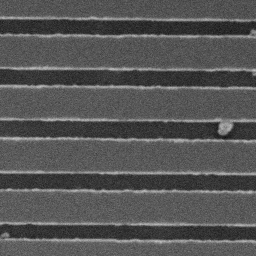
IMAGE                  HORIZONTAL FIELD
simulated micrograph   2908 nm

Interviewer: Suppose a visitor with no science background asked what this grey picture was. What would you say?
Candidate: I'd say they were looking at lines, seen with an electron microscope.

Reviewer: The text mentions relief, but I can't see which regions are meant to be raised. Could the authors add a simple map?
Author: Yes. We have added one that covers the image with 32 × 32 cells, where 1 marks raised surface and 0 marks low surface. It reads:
11111111111111111111111111111111
11111111111111111111111111111111
00000000000000000001111111111111
00000000000000000000000000000000
11111111111110011111100000000001
11111111111111111111111111111111
11111111111111111111111111111111
11111111111111111111111111111111
11111111111111111111111111111111
00000000000000000000000000000000
00000000000000000000000000000000
11111111111111111111111111111111
11111111111111111111111111111111
11111111111111111111111111111111
11111111111111111111111111111111
00000000000000000000000000011000
00000000000000000000000000000000
11111111111111111111111111110000
11111111111111111111111111111111
11111111111111111111111111111111
11111111111111111111111111111111
11111111111111111111111111111111
00000000000000000000000000000000
00000000000000000000000000000000
11111111111111111111111111111111
11111111111111111111111111111111
11111111111111111111111111111111
11111111111111111111111111111111
00000000000000000000000000000000
00000000000000000000000000000000
11111111111111111111111111111111
11111111111111111111111111111111